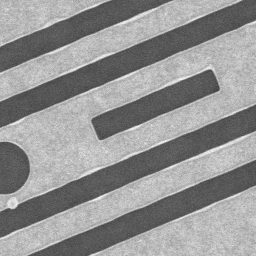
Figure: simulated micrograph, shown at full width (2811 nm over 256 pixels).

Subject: groups of lines, slits or small figures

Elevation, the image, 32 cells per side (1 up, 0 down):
11111111111110000000011111111000
11111111110000000001111111100000
11111110000000001111111100000000
11111000000001111111110000000011
11100000000111111110000000001111
10000000011111111000000001111111
00000001111111100000000111111111
00001111111100000000111111111111
01111111110000000011111111111111
11111110000000001111111100011111
11111000000001111111100000011111
11100000000111111110000000011111
00000000111111111000000001111111
00000011111111000000001111111110
00001111111100000000111111110000
00111111111000000011111111000000
11111111111100011111111100000000
11111111111111111111100000000011
00011111111111111110000000011111
00011111111111110000000001111111
00001111111111000000001111111100
00001111111000000000111111110000
00011111100000000111111111000000
00011110000000011111111000000001
11111000000001111111100000000111
11000000001111111110000000011111
00000000111111110000000011111111
00000011111111000000001111111111
00011111111100000000111111111111
01111111100000000111111111111111
11111100000000011111111111111111
11110000000011111111111111111111